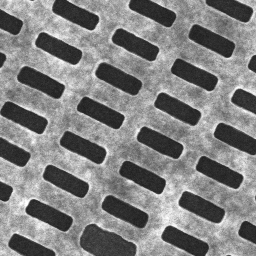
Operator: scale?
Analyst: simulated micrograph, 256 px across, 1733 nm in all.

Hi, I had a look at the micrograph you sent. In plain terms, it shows a regular array of holes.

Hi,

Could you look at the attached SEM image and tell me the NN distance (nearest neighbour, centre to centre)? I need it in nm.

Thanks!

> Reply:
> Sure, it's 259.